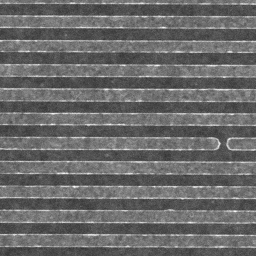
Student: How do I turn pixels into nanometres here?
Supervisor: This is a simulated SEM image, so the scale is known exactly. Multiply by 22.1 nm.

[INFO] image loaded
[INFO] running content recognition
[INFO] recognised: parallel lines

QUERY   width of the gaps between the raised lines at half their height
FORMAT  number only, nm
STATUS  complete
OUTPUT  271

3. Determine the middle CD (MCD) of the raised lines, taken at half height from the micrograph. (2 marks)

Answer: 0.271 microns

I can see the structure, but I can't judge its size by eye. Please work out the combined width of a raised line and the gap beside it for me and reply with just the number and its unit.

0.538 microns